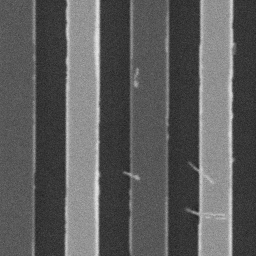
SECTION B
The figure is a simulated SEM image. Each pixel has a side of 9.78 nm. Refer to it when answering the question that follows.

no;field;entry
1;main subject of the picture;lines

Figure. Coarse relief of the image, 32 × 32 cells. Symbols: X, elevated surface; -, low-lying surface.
XXXX----XXXX----XXXXX----XXXX---
XXXX----XXXX----XXXXX----XXXX---
XXXX----XXXX----XXXXX----XXXX---
XXXX----XXXX----XXXXX----XXXX---
XXXX----XXXX----XXXXX----XXXX---
XXXX----XXXX----XXXXX----XXXX---
XXXX----XXXX----XXXXX----XXXX---
XXXX----XXXX----XXXXX----XXXX---
XXXX----XXXX----XXXXX----XXXX---
XXXX----XXXX----XXXXX----XXXX---
XXXX----XXXX----XXXXX----XXXX---
XXXX----XXXX----XXXXX----XXXX---
XXXX----XXXX----XXXXX----XXXX---
XXXX----XXXX----XXXXX----XXXX---
XXXX----XXXX----XXXXX----XXXX---
XXXX----XXXX----XXXXX----XXXX---
XXXX----XXXX----XXXXX----XXXX---
XXXX----XXXX----XXXXX----XXXX---
XXXX----XXXX----XXXXX----XXXX---
XXXX----XXXX----XXXXX----XXXX---
XXXX----XXXX----XXXXX----XXXX---
XXXX----XXXX----XXXXX----XXXX---
XXXX----XXXX----XXXXX----XXXX---
XXXX----XXXX----XXXXX----XXXX---
XXXX----XXXX----XXXXX----XXXX---
XXXX----XXXX----XXXXX----XXXX---
XXXX----XXXX----XXXXX----XXXX---
XXXX----XXXX----XXXXX----XXXX---
XXXX----XXXX----XXXXX----XXXX---
XXXX----XXXX----XXXXX----XXXX---
XXXX----XXXX----XXXXX----XXXX---
XXXX----XXXX----XXXXX----XXXX---